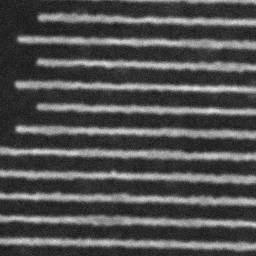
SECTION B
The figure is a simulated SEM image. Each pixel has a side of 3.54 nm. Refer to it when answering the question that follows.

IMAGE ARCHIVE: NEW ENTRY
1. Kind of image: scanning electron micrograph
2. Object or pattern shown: parallel lines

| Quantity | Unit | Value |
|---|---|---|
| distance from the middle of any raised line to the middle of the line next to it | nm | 79.2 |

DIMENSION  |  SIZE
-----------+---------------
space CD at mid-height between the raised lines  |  60.6 nm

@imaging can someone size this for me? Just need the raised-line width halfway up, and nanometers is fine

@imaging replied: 16.8